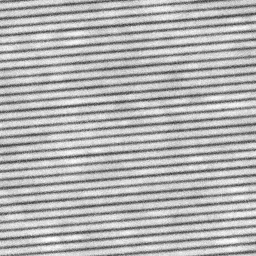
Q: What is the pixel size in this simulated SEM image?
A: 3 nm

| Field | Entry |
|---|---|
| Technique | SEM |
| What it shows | parallel lines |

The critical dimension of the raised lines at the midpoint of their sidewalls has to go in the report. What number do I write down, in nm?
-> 17.9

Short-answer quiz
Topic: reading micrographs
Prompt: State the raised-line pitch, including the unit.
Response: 8.47 pixels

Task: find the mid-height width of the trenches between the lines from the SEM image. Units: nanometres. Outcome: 7.8